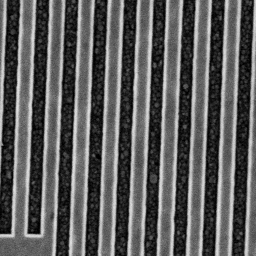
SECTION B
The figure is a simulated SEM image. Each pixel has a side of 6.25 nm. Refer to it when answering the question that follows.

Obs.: parallel lines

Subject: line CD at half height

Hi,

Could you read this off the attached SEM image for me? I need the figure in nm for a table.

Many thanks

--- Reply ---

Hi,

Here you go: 84.2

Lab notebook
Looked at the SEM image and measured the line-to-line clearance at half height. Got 95.2 nanometers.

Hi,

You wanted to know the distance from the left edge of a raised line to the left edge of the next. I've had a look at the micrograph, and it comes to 183 nm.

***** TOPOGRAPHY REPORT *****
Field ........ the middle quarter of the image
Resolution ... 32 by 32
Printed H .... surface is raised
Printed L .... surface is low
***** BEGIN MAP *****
LLLHHHHLLLLHHHLLLLHHHLLLLHHHHLLL
LLLHHHHLLLLHHHLLLLHHHLLLLHHHHLLL
LLLHHHHLLLLHHHLLLLHHHLLLLHHHHLLL
LLLHHHHLLLLHHHLLLLHHHLLLLHHHHLLL
LLLHHHHLLLLHHHLLLLHHHLLLLHHHHLLL
LLLHHHHLLLLHHHLLLLHHHLLLLHHHHLLL
LLLHHHHLLLLHHHLLLLHHHLLLLHHHLLLL
LLLHHHLLLLLHHHLLLLHHHLLLLHHHLLLL
LLLHHHLLLLHHHHLLLLHHHLLLLHHHLLLL
LLLHHHLLLLHHHHLLLLHHHLLLLHHHLLLL
LLLHHHLLLLHHHHLLLLHHHLLLLHHHLLLL
LLLHHHLLLLHHHHLLLLHHHLLLLHHHLLLL
LLLHHHLLLLHHHLLLLLHHHLLLLHHHLLLL
LLLHHHLLLLHHHLLLLHHHHLLLLHHHLLLL
LLLHHHLLLLHHHLLLLHHHHLLLLHHHLLLL
LLLHHHLLLLHHHLLLLHHHHLLLLHHHLLLL
LLLHHHLLLLHHHLLLLHHHHLLLLHHHLLLL
LLLHHHLLLLHHHLLLLHHHHLLLLHHHLLLL
LLLHHHLLLLHHHLLLLHHHHLLLLHHHLLLL
LLLHHHLLLLHHHLLLLHHHHLLLLHHHLLLL
LLLHHHLLLLHHHLLLLHHHHLLLLHHHLLLL
LLLHHHLLLLHHHLLLLHHHHLLLLHHHLLLL
LLLHHHLLLLHHHLLLLHHHLLLLLHHHLLLL
LLLHHHLLLLHHHLLLLHHHLLLLHHHHLLLL
LLHHHHLLLLHHHLLLLHHHLLLLHHHHLLLL
LLHHHHLLLLHHHLLLLHHHLLLLHHHHLLLL
LLHHHHLLLLHHHLLLLHHHLLLLHHHHLLLL
LLHHHHLLLLHHHLLLLHHHLLLLHHHHLLLL
LLHHHHLLLLHHHLLLLHHHLLLLHHHHLLLL
LLHHHHLLLLHHHLLLLHHHLLLLHHHHLLLL
LLHHHHLLLLHHHLLLLHHHLLLLHHHHLLLL
LLHHHHLLLLHHHLLLLHHHLLLLHHHHLLLL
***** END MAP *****